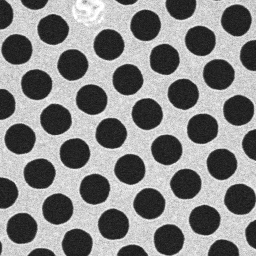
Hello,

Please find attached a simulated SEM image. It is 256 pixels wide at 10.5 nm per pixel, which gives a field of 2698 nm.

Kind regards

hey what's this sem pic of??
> a regular array of holes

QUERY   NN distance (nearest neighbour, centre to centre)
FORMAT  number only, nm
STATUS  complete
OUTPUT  416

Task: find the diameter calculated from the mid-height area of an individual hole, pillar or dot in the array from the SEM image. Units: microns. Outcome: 0.33